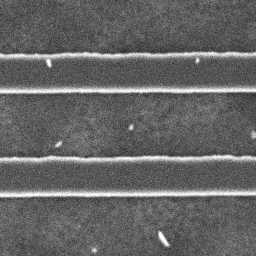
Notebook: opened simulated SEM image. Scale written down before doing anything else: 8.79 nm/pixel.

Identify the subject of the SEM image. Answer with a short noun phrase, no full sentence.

lines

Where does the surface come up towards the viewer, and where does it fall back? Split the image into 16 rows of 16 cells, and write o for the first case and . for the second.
................
................
................
oooooooooooooooo
oooooooooooooooo
oooooooooooooooo
................
................
................
................
oooooooooooooooo
oooooooooooooooo
................
................
................
................